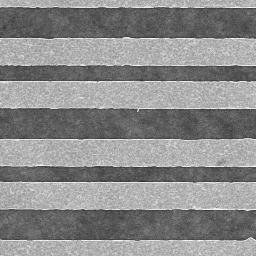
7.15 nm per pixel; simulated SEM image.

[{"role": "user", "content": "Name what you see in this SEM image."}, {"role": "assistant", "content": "parallel lines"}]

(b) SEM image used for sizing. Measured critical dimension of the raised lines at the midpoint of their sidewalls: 193 nm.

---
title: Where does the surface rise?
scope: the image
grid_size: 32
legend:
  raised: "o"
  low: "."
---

oooooooooooooooooooooooooooooooo
................................
................................
................................
................................
oooooooooooooooooooooooooooooooo
oooooooooooooooooooooooooooooooo
oooooooooooooooooooooooooooooooo
................................
................................
ooooooooooo.oooooooooooooooooooo
oooooooooooooooooooooooooooooooo
oooooooooooooooooooooooooooooooo
................oooooooooooo.ooo
................................
................................
................................
oooo.oo.oo.ooooooooooo...ooooooo
oooooooooooooooooooooooooooooooo
oooooooooooooooooooooooooooooooo
oooooooooooooooooooooooooooooooo
................................
................................
oooooooooooooooooooooooooooooooo
oooooooooooooooooooooooooooooooo
oooooooooooooooooooooooooo.ooooo
................................
................................
................................
................................
oooooooooooooooooooooooooooooooo
oooooooooooooooooooooooooooooooo